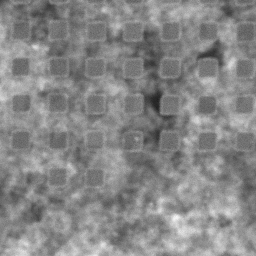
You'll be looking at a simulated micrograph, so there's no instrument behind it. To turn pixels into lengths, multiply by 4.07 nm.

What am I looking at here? a regular array of raised bodies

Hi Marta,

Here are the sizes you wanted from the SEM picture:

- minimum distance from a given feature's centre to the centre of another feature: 148 nanometers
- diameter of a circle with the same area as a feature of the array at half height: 0.0881 um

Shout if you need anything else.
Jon